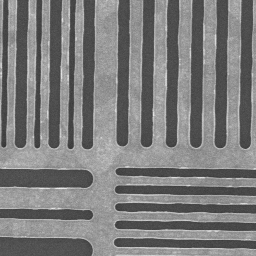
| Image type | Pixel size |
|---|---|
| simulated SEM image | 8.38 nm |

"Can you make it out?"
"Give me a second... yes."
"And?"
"groups of lines, slits or small figures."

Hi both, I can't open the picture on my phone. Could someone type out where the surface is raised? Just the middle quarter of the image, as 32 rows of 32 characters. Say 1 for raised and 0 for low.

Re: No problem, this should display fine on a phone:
10010000111110000110000111000111
10011000111110000110000111000111
10011000111110000110000111000111
10011000111110000110000111000111
10011000111110001110000111000111
10010000111110001110000111000111
10010000111110001110000111000111
10010000111110001110000111000111
10010000111110001110000110000110
10010000111110001110001110001110
10010000111110001110001110001110
10010000111110001110001110001110
10010000111110001110001110000110
10010000111110001110001110000110
10010000111110001110001110000110
10010000111110001110001110000110
10010000111110001110001110001110
10010000111110001110001110001110
10010000111110001110001110001110
10010000111110001110001110001110
10010001111111011111001111001111
11111111111111111111111111111111
11111111111111111111111111111111
11111111111111111111111111111111
11111111111111111111111111111111
11111111111111111111111111111111
00000011111110000000000000000000
00000001111110000000000000000000
00000001111111111111111111111111
00000001111111111111111111111111
00000001111110000000000000000000
11111111111110000000000000000000